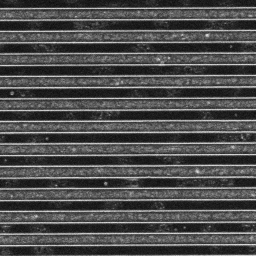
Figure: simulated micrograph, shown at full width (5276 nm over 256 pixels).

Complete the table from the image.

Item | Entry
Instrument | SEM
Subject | parallel lines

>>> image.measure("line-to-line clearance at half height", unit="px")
10.7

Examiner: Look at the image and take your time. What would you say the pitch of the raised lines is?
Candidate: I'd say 464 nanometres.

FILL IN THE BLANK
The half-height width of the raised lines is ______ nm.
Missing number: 240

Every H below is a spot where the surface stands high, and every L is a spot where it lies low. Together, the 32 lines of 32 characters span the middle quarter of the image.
HHHHHHHHHHHHHHHHHHHHHHHHHHHHHHHH
HHHHHHHHHHHHHHHHHHHHHHHHHHHHHHHH
HHHHHHHHHHHHHHHHHHHHHHHHHHHHHHHH
LLLLLLLLLLLLLLLLLLLLLLLLLLLLLLLL
LLLLLLLLLLLLLLLLLLLLLLLLLLLLLLLL
LLLLLLLLLLLLLLLLLLLLLLLLLLLLLLLL
HHHHHHHHHHHHHHHHHHHHHHHHHHHHHHHH
HHHHHHHHHHHHHHHHHHHHHHHHHHHHHHHH
HHHHHHHHHHHHHHHHHHHHHHHHHHHHHHHH
LLLLLLLLLLLLLLLLLLLLLLLLLLLLLLLL
LLLLLLLLLLLLLLLLLLLLLLLLLLLLLLLL
LLLLLLLLLLLLLLLLLLLLLLLLLLLLLLLL
HHHHHHHHHHHHHHHHHHHHHHHHHHHHHHHH
HHHHHHHHHHHHHHHHHHHHHHHHHHHHHHHH
LLLLLLLLLLLLLLLLLLLLLLLLLLLLLLLL
LLLLLLLLLLLLLLLLLLLLLLLLLLLLLLLL
LLLLLLLLLLLLLLLLLLLLLLLLLLLLLLLL
HHHHHHHHHHHHHHHHHHHHHHHHHHHHHHHH
HHHHHHHHHHHHHHHHHHHHHHHHHHHHHHHH
HHHHHHHHHHHHHHHHHHHHHHHHHHHHHHHH
LLLLLLLLLLLLLLLLLLLLLLLLLLLLLLLL
LLLLLLLLLLLLLLLLLLLLLLLLLLLLLLLL
LLLLLLLLLLLLLLLLLLLLLLLLLLLLLLLL
HHHHHHHHHHHHHHHHHHHHHHHHHHHHHHHH
HHHHHHHHHHHHHHHHHHHHHHHHHHHHHHHH
LLLLLLLLLLLLLLLLLLLLLLLLLLLLLLLL
LLLLLLLLLLLLLLLLLLLLLLLLLLLLLLLL
LLLLLLLLLLLLLLLLLLLLLLLLLLLLLLLL
LLLLLLLLLLLLLLLLLLLHHHHHHHHHHHHH
HHHHHHHHHHHHHHHHHHHHHHHHHHHHHHHH
HHHHHHHHHHHHHHHHHHHHHHHHHHHHHHHH
LLLLLLLLLLLLLLLLLLLLLLLLLLLLLLLL